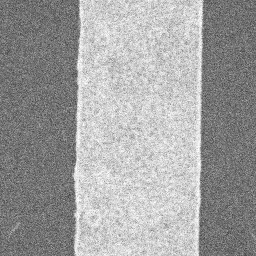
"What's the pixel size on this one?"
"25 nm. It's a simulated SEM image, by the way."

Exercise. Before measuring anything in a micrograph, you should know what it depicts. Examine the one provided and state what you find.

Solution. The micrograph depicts one or a few lines or trenches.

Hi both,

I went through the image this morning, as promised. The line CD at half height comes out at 2.99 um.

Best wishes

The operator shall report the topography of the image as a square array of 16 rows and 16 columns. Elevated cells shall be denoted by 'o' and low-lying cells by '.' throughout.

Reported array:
.....oooooooo...
.....oooooooo...
.....ooooooo....
.....ooooooo....
.....ooooooo....
.....ooooooo....
.....ooooooo....
.....ooooooo....
.....ooooooo....
.....ooooooo....
.....ooooooo....
.....ooooooo....
.....ooooooo....
.....ooooooo....
.....ooooooo....
.....ooooooo....